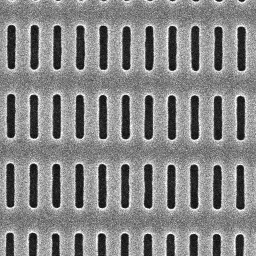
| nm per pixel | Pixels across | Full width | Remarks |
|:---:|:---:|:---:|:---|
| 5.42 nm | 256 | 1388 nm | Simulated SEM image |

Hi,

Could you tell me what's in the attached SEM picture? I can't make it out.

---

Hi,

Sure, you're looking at a regular array of holes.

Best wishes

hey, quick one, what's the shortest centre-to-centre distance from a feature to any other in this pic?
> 124 nanometres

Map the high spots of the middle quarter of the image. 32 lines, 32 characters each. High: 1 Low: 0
11100111100111100111001111001111
11111111111111101111101111001111
11111111111111111111111111111111
11111111111111111111111111111111
11111111111111111111111111111111
11111111111111111111111111111111
11111111111111111111111111111111
11111111111111111111111111111111
11100111100111001111001111001111
11100111100111001111001111001110
11100111100111000111001111001110
11100111100111000111001111001110
11100111100111000111001111001110
11100111100111000111001111001111
11100111100111000111001111001111
11100111100111000111001111001111
11100111100111000111001111001111
11100111100111000111001111001111
11100111100111101111001111001111
11111111111111111111111111111111
11111111111111111111111111111111
11111111111111111111111111111111
11111111111111111111111111111111
11111111111111111111111111111111
11111111111111111111111111111111
11100111101111001111001111001111
11100111000111001111001111001110
11100111000111001111001111001110
11100111000111001111001111001110
11100111000111001111001111001110
11100111000111001111001111001110
11100111000111001111001111001111